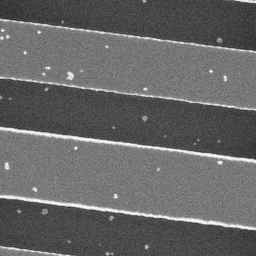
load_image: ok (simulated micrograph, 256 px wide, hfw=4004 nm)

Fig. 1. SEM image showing lines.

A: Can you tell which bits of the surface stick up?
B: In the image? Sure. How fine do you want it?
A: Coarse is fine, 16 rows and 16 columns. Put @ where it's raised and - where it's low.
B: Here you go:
----------------
@@@-------------
@@@@@@@@@@------
@@@@@@@@@@@@@@@@
@@@@@@@@@@@@@@@@
-----@@@@@@@@@@@
-------------@@@
----------------
@@@@------------
@@@@@@@@@@@@----
@@@@@@@@@@@@@@@@
@@@@@@@@@@@@@@@@
-@@@@@@@@@@@@@@@
---------@@@@@@@
----------------
@---------------